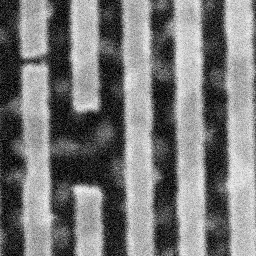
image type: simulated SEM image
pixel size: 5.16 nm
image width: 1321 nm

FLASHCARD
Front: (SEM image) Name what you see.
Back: parallel lines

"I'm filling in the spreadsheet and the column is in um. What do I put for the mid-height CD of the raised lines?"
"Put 0.116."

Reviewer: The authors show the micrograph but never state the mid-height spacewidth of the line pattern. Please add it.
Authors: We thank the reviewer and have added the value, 148 nanometers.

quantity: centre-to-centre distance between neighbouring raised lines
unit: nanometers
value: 266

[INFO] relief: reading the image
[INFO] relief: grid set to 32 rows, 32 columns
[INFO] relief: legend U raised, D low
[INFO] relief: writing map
DDDUUUDDDUUUDDDDUUUDDDUUUDDDUUUD
DDDUUUDDDUUUDDDDUUUDDDUUUDDDUUUD
DDDUUUDDDUUUDDDDUUDDDDUUUDDDUUUD
DDDUUUDDDUUUDDDDUUDDDDUUUDDDUUUD
DDDUUUDDDUUUDDDDUUUDDDUUUDDDDUUD
DDDUUUDDDUUUDDDDUUUDDDUUUDDDDUUD
DDDUUDDDDUUUDDDDUUUDDDUUUDDDDUUD
DDDDDDDDDUUUDDDDUUUDDDUUUDDDDUUD
DDDUUUDDDUUUDDDDUUUDDDUUUDDDDUUU
DDDUUUDDDUUUDDDDUUUDDDUUUDDDDUUU
DDDUUUDDDUUUDDDDUUUDDDUUUDDDDUUD
DDDUUUDDDUUUDDDDUUUDDDUUUDDDDUUD
DDDUUUDDDUUUDDDDUUUDDDUUUDDDDUUD
DDDUUUDDDDUDDDDDUUUDDDUUUDDDDUUU
DDDUUUDDDDDDDDDDUUUDDDUUUDDDDUUU
DDDUUUDDDDDDDDDDUUUDDDUUUDDDDUUU
DDDUUUDDDDDDDDDDUUUDDDUUUDDDDUUD
DDDUUUDDDDDDDDDDUUUDDDUUUDDDDUUU
DDDUUUDDDDDDDDDDUUUDDDUUUDDDDUUU
DDDDUUDDDDDDDDDDUUUDDDUUUDDDDUUU
DDDDUUDDDDDDDDDDUUUDDDUUUDDDDUUU
DDDDUUDDDDDDDDDDUUUDDDUUUDDDDUUU
DDDUUUDDDDDDDDDDUUUDDDDUUDDDDUUU
DDDUUUDDDDDDDDDDUUUDDDDUUDDDDUUU
DDDUUUDDDDUUUDDDUUUDDDUUUDDDDUUU
DDDUUUDDDDUUDDDDUUUDDDUUUDDDDUUU
DDDUUUDDDDUUDDDDUUUDDDUUUDDDDUUU
DDDUUUDDDDUUDDDDUUUDDDDUUDDDDUUU
DDDUUUDDDDUUUDDDUUUDDDDUUDDDDUUU
DDDUUUDDDDUUUDDDUUUDDDDUUDDDDUUU
DDDUUUDDDDUUUDDDUUUDDDDUUDDDDUUU
DDDUUUDDDDUUUDDDUUUDDDDUUUDDDUUU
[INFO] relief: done